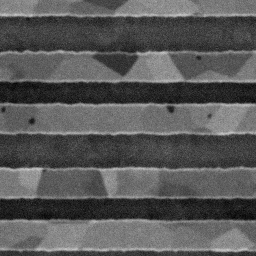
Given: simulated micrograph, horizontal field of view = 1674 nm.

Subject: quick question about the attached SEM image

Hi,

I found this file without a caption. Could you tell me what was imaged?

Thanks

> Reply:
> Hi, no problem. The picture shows lines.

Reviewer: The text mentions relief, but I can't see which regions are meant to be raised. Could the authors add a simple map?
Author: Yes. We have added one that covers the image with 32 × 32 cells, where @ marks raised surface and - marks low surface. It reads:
@@@@@@@@@@@@@@@@@@@@@@@@@@@@@@@@
@@@@@@@@@@@@@@@@@@@@@@@@@@@@@@@@
--------------------------------
--------------------------------
--------------------------------
--------------------------------
-@-@@@@@@-@@--@-----@@@@@---@@@@
@@@@@@@@@@@@@@@@@@@@@@@@@@@@@@@@
@@@@@@@@@@@@@@@@@@@@@@@@@@@@@@@@
@@@@@@@@@@@@@@@@@@@@@@@@@@@@@@@@
--------------------------------
--------------------------------
--------------------------------
@@@@@@@@@@@@@@@@@@@@@@@@@@@@@@@@
@@@@@@@@@@@@@@@@@@@@@@@@@@@@@@@@
@@@@@@@@@@@@@@@@@@@@@@@@@@@@@@@@
@@@@@@@@@@@@@@@@@@@@@@@@@@@@@@@@
--------------------------------
--------------------------------
--------------------------------
--------------------------------
@@@@@@@@@@@@@@@@@@@@@@@@@@@@@@@@
@@@@@@@@@@@@@@@@@@@@@@@@@@@@@@@@
@@@@@@@@@@@@@@@@@@@@@@@@@@@@@@@@
@@@@@@@@@@@@@@@@@@@@@@@@@@@@@@@@
--------------------------------
--------------------------------
-@@---@@@----@@@@@@-------------
@@@@@@@@@@@@@@@@@@@@@@@@@@@@@@@@
@@@@@@@@@@@@@@@@@@@@@@@@@@@@@@@@
@@@@@@@@@@@@@@@@@@@@@@@@@@@@@@@@
--------------------------------